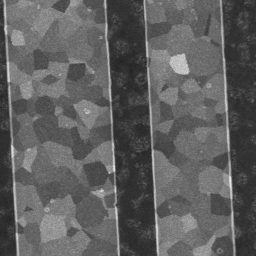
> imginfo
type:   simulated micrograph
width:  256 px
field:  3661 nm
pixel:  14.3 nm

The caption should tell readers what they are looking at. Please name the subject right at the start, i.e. one or a few lines or trenches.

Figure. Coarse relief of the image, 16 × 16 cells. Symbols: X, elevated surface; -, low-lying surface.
XXXXXXX--XXXXX--
XXXXXXX--XXXXX--
XXXXXXX--XXXXX--
XXXXXXX--XXXXX--
-XXXXXX--XXXXX--
-XXXXXX--XXXXX--
-XXXXXX--XXXXX--
-XXXXXX--XXXXX--
-XXXXXX--XXXXX--
-XXXXXX---XXXX--
-XXXXXX---XXXX--
-XXXXXX---XXXX--
-XXXXXX---XXXX--
-XXXXXX---XXXXX-
-XXXXXX---XXXXX-
-XXXXXX---XXXXX-